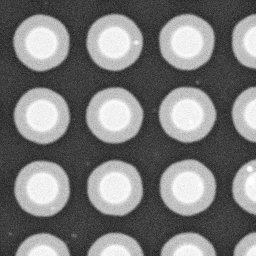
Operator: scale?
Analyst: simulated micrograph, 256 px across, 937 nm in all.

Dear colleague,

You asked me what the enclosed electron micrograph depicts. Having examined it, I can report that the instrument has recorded an array of small figures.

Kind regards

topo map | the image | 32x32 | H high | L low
LLLLLLLLLLLLLLLLLLLLLLLLLLLLLLLL
LLLLLLLLLLLLLLLLLLLLLLLLLLLLLLLL
LLLHHHHLLLLLHHHHLLLLLHHHHLLLLLHH
LLHHHHHHLLLHHHHHHLLLHHHHHHLLLHHH
LLHHHHHHHLLHHHHHHHLLHHHHHHHLLHHH
LLHHHHHHHLLHHHHHHHLLHHHHHHHLLHHH
LLHHHHHHLLLHHHHHHHLLHHHHHHHLLHHH
LLLHHHHHLLLLHHHHHLLLLHHHHHLLLLHH
LLLLHHLLLLLLLHHHLLLLLLHHHLLLLLLL
LLLLLLLLLLLLLLLLLLLLLLLLLLLLLLLL
LLLLLLLLLLLLLLLLLLLLLLLLLLLLLLLL
LLLLHHHLLLLLHHHHLLLLLHHHHLLLLLHH
LLHHHHHHLLLHHHHHHLLLHHHHHHLLLLHH
LLHHHHHHHLLHHHHHHHLLHHHHHHHLLHHH
LLHHHHHHHLLHHHHHHHLLHHHHHHHLLHHH
LLHHHHHHHLLHHHHHHHLLHHHHHHHLLHHH
LLHHHHHHLLLLHHHHHLLLLHHHHHLLLLHH
LLLLHHHLLLLLLHHHLLLLLLHHHLLLLLLH
LLLLLLLLLLLLLLLLLLLLLLLLLLLLLLLL
LLLLLLLLLLLLLLLLLLLLLLLLLLLLLLLL
LLLLHHHLLLLLLHHHLLLLLLHHHLLLLLLH
LLLHHHHHLLLLHHHHHLLLLHHHHHLLLLHH
LLHHHHHHHLLHHHHHHHLLHHHHHHHLLHHH
LLHHHHHHHLLHHHHHHHLLHHHHHHHLLHHH
LLHHHHHHHLLHHHHHHHLLHHHHHHHLLHHH
LLHHHHHHLLLLHHHHHLLLLHHHHHLLLLHH
LLLHHHHLLLLLLHHHLLLLLLHHHLLLLLLH
LLLLLLLLLLLLLLLLLLLLLLLLLLLLLLLL
LLLLLLLLLLLLLLLLLLLLLLLLLLLLLLLL
LLLLHHHLLLLLLHHHLLLLLLHHHLLLLLLH
LLLHHHHHLLLLHHHHHLLLLHHHHHLLLLHH
LLHHHHHHHLLHHHHHHHLLHHHHHHHLLHHH